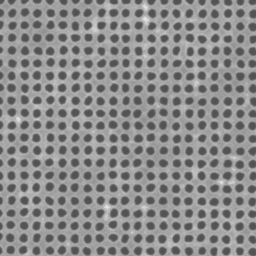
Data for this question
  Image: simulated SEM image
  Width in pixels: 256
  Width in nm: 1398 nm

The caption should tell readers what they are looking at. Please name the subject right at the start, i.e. a regular array of holes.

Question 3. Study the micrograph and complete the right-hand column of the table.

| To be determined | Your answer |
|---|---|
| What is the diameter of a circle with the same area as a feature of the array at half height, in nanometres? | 47.8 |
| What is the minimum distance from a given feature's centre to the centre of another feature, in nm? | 65.6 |